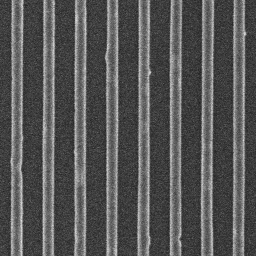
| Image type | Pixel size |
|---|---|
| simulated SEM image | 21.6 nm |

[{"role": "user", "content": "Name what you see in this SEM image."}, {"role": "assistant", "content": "parallel lines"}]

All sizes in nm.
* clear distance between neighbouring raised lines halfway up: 457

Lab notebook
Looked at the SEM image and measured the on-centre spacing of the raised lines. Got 0.685 micrometres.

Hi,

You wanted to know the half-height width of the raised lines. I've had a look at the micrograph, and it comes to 0.219 µm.